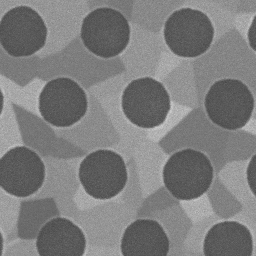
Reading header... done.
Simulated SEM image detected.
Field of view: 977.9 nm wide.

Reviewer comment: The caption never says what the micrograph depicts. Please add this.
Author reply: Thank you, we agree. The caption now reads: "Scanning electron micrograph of holes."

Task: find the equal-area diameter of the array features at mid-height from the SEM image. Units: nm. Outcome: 194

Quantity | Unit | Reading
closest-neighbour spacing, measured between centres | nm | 313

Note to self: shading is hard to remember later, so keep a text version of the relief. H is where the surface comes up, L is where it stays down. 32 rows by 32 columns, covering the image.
HHHHHHHHHHHHHHHHHHHHHHHHHHHHHHHH
HLLLLHHHHHHLLLLHHHHHHHLLLHHHHHHH
LLLLLHHHHHLLLLLLHHHHHLLLLLHHHHHH
LLLLLLHHHHLLLLLLHHHHLLLLLLLHHHHL
LLLLLLHHHHLLLLLLHHHHLLLLLLLHHHHL
LLLLLLHHHHLLLLLLHHHHHLLLLLHHHHHL
HLLLLHHHHHHLLLLHHHHHHLLLLLHHHHHH
HHHHHHHHHHHHHHHHHHHHHHHHHHHHHHHH
HHHHHHHHHHHHHHHHHHHHHHHHHHHHHHHH
HHHHHHHHHHHHHHHHHHHHHHHHHHHHHHHH
HHHHHHLLLLHHHHHHLLLLHHHHHHHLLLLH
HHHHHLLLLLLHHHHLLLLLLHHHHHLLLLLH
LHHHHLLLLLLHHHHLLLLLLHHHHHLLLLLL
HHHHHLLLLLLHHHHLLLLLLHHHHHLLLLLL
HHHHHLLLLLHHHHHHLLLLLHHHHHLLLLLH
HHHHHHLLLHHHHHHHHLLLHHHHHHHLLLLH
HHHHHHHHHHHHHHHHHHHHHHHHHHHHHHHH
HHHHHHHHHHHHHHHHHHHHHHHHHHHHHHHH
HLLLHHHHHHHHHHHHHHHHHHHHHHHHHHHH
LLLLLHHHHHHLLLLHHHHHHLLLLLHHHHHH
LLLLLLHHHHLLLLLLHHHHHLLLLLHHHHHL
LLLLLLHHHHLLLLLLHHHHLLLLLLLHHHHL
LLLLLLHHHHLLLLLLHHHHLLLLLLLHHHHL
LLLLLHHHHHLLLLLLHHHHHLLLLLHHHHHL
HHLLHHHHHHHLLLHHHHHHHHLLLHHHHHHH
HHHHHHHHHHHHHHHHHHHHHHHHHHHHHHHH
HHHHHHHHHHHHHHHHHHHHHHHHHHHHHHHH
HHHHHHLLLHHHHHHHHLLHHHHHHHHHHHHH
HHHHHLLLLLHHHHHHLLLLHHHHHHLLLLLH
HHHHHLLLLLLHHHHLLLLLLHHHHHLLLLLL
HHHHHLLLLLLHHHHLLLLLLHHHHLLLLLLL
HHHHHLLLLLLHHHHLLLLLLHHHHLLLLLLL